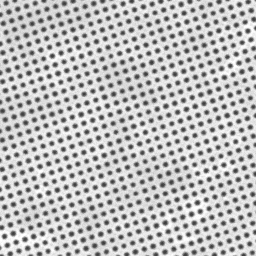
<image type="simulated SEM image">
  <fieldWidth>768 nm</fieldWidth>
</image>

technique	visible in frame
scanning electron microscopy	a regular array of holes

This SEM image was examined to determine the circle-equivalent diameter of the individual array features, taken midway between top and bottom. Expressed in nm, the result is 16.9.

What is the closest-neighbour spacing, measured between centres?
27.1 nanometers